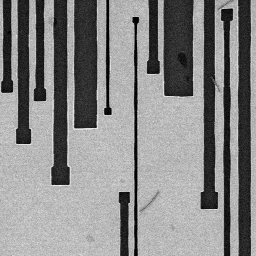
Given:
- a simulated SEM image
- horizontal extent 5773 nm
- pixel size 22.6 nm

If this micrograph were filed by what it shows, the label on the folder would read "groups of lines, slits or small figures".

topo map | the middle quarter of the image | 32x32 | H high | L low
LHLLLLLLHHLLHHHHHLLHHLLLHLLLLLLL
LHLLLLLLHHLLHHHHHLLHHLLLHLLLLLLL
LHLLLLLLHHLLHHHHHLLHHLLLHLLLLLLL
LHLLLLLLHHLLHHHHHLLHHHHHHLLLLLLL
LHLLLLLLHHLHHHHHHLLHHHHHHLLLLLLL
LHLLLLLLHHLHHHHHHLLHHHHHHLLLLLLL
LHLLLLLLHHLHHHHHHLLHHHHHHLLLLLLL
LHLLLLLLHHLHHHHHHLLHHHHHHLLLLLLL
LHLLLLLLHHLHHHHHHLLHHHHHHHHHHHHH
LHLLLLLLHHLHHHHHHLLHHHHHHHHHHHHH
LHLLLLLLHHLLHHHHHLLHHHHHHHHHHHHH
LHLLLLLLHHLLHHHHHLLHHHHHHHHHHHHH
LHLLLLLLHHLLHHHHHLLHHHHHHHHHHHHH
LHLLLLLLHHHHHHHHHLLHHHHHHHHHHHHH
LHLLLLLLHHHHHHHHHLLHHHHHHHHHHHHH
LHLLLLLLHHHHHHHHHLLHHHHHHHHHHHHH
LHHHHHHHHHHHHHHHHLLHHHHHHHHHHHHH
LHHHHHHHHHHHHHHHHLLHHHHHHHHHHHHH
LHHHHHHHHHHHHHHHHLLHHHHHHHHHHHHH
LHHHHHHHHHHHHHHHHLLHHHHHHHHHHHHH
LHHHHHHHHHHHHHHHHLLHHHHHHHHHHHHH
LHHHHHHHHHHHHHHHHLLHHHHHHHHHHHHH
LHHHHHHHHHHHHHHHHLLHHHHHHHHHHHHH
LHHHHHHHHHHHHHHHHLLHHHHHHHHHHHHH
LHHHHHHHHHHHHHHHHLLHHHHHHHHHHHHH
LHHHHHHHHHHHHHHHHLLHHHHHHHHHHHHH
LLHHHHHHHHHHHHHHHLLHHHHHHHHHHHHH
LLHHHHHHHHHHHHHHHLLHHHHHHHHHHHHH
LLHHHHHHHHHHHHHHHLLHHHHHHHHHHHHH
LLHHHHHHHHHHHHHHHLLHHHHHHHHHHHHH
HHHHHHHHHHHHHHHHHLLHHHHHHHHHHHHH
HHHHHHHHHHHHHHHHHLLHHHHHHHHHHHHH